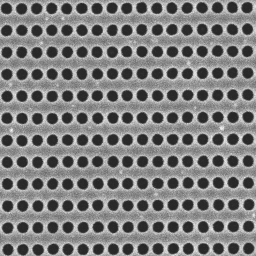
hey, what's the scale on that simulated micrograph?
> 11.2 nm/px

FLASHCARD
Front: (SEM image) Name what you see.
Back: a regular array of holes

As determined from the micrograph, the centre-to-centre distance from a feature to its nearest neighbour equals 166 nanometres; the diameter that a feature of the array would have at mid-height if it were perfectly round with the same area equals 130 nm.